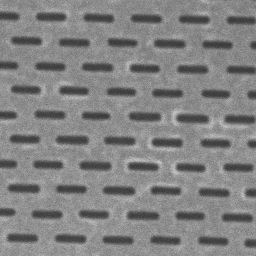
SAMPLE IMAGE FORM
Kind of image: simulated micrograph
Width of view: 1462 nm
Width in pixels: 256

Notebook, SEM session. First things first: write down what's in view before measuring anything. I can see a regular array of holes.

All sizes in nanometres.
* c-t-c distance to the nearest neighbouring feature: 191